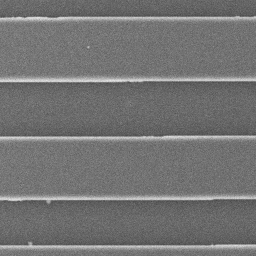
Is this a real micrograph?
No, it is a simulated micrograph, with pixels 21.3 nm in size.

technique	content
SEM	lines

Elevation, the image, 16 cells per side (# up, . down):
................
################
################
################
################
................
................
................
................
################
################
################
#...............
................
................
################